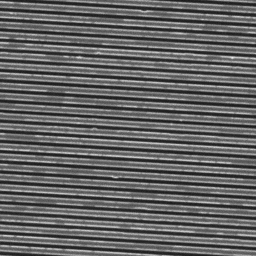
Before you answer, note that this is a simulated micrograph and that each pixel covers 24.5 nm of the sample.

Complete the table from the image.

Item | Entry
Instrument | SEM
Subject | parallel lines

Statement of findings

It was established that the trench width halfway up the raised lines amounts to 0.104 microns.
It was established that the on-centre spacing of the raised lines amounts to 248 nanometres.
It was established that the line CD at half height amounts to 0.147 um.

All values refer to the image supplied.